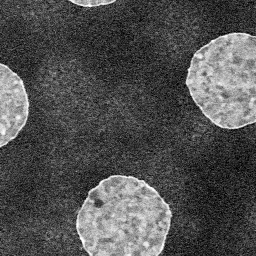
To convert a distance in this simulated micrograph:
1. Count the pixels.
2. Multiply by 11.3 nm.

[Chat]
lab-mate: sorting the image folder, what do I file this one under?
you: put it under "raised bodies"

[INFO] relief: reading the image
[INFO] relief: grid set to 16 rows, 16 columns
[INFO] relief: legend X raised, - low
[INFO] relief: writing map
----------------
----------------
-------------XXX
------------XXXX
X-----------XXXX
X-----------XXXX
XX----------XXXX
XX-----------XXX
X---------------
----------------
----------------
------XXX-------
-----XXXXX------
-----XXXXXX-----
-----XXXXX------
-----XXXXX------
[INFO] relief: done